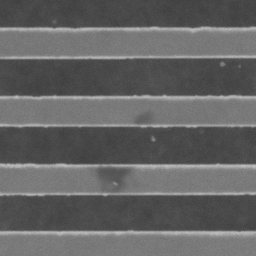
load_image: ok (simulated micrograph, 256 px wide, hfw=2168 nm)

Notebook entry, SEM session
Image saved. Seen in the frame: lines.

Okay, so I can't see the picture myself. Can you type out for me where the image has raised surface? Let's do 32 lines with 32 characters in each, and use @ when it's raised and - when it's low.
--------------------------------
--------------------------------
--------------------------------
--------------------------------
@@@@@@@@@@@@@@@@@@@@@@@@@@@@@@@@
@@@@@@@@@@@@@@@@@@@@@@@@@@@@@@@@
@@@@@@@@@@@@@@@@@@@@@@@@@@@@@@@@
--------------------------------
--------------------------------
--------------------------------
--------------------------------
--------------------------------
@@@@@@@@@@@@@@@@@@@@@@@@@@@@@@@@
@@@@@@@@@@@@@@@@@@@@@@@@@@@@@@@@
@@@@@@@@@@@@@@@@@@@@@@@@@@@@@@@@
@@@@@@@@@@@@@@@@@@@@@@@@@@@@@@@@
--------------------------------
--------------------------------
--------------------------------
--------------------------------
--------------------------------
@@@@@@@@@@@@@@@@@@@@@@@@@@@@@@@@
@@@@@@@@@@@@@@@@@@@@@@@@@@@@@@@@
@@@@@@@@@@@@@@@@@@@@@@@@@@@@@@@@
--------------------------------
--------------------------------
--------------------------------
--------------------------------
--------------------------------
@@@@@@@@@@@@@@@@@@@@@@@@@@@@@@@@
@@@@@@@@@@@@@@@@@@@@@@@@@@@@@@@@
@@@@@@@@@@@@@@@@@@@@@@@@@@@@@@@@